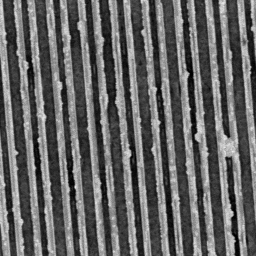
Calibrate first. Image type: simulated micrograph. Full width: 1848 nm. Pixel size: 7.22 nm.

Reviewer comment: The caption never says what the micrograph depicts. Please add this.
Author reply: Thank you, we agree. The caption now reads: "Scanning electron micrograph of parallel lines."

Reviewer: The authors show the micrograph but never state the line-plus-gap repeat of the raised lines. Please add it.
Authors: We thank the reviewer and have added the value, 115 nm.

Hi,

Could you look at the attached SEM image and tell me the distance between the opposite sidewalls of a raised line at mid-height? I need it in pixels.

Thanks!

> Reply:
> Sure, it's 5.86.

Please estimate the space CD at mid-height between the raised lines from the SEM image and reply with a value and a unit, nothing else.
69.2 nanometers